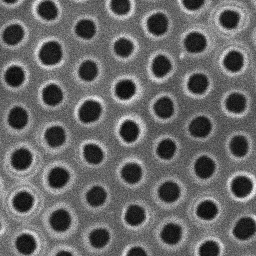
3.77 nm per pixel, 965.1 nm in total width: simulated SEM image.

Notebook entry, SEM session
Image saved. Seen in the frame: a regular array of holes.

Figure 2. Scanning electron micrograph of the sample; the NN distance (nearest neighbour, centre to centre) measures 0.156 micrometres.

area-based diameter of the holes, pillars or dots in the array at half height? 83.2 nm